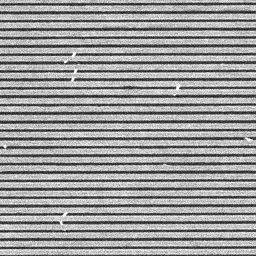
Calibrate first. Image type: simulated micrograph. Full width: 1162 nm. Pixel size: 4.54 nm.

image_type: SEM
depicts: parallel lines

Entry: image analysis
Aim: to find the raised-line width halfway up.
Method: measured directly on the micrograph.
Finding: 0.0238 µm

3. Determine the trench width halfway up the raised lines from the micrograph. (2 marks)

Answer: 15.9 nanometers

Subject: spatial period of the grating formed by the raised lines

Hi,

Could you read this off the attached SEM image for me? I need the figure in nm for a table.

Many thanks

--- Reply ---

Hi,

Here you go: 38.1